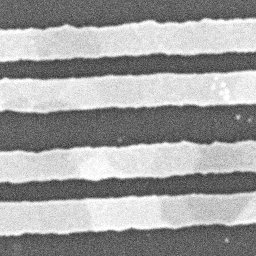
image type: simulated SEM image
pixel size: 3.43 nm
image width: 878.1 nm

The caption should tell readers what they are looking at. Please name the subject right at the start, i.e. lines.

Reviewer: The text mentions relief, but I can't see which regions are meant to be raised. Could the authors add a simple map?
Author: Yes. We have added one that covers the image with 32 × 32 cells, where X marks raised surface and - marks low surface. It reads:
--------------------------------
--------------------------------
-----------------------------X-X
------XXX-XX-XXXXXXXXXXXXXXXXXXX
XXXXXXXXXXXXXXXXXXXXXXXXXXXXXXXX
XXXXXXXXXXXXXXXXXXXXXXXXXXXXXXXX
XXXXXXXXXXXXXXXXXXXXXXXXXXXX----
XX------------------------------
--------------------------------
----------------XXXXXXXXXXXXXXXX
XXXXXXXXXXXXXXXXXXXXXXXXXXXXXXXX
XXXXXXXXXXXXXXXXXXXXXXXXXXXXXXXX
XXXXXXXXXXXXXXXXXXXXXXXXXXXXXXXX
XXXXXXXXXXXX--------------------
--------------------------------
--------------------------------
--------------------------------
--------------------------------
----------X--X-XXXXXXXXXXXXXXXXX
XXXXXXXXXXXXXXXXXXXXXXXXXXXXXXXX
XXXXXXXXXXXXXXXXXXXXXXXXXXXXXXXX
XXXXXXXXXXXXXXXXXXXXXXXXXXXXX---
XXXXXX--------------------------
--------------------------------
-----------------------XXXXXXXXX
XXXXXXXXXXXXXXXXXXXXXXXXXXXXXXXX
XXXXXXXXXXXXXXXXXXXXXXXXXXXXXXXX
XXXXXXXXXXXXXXXXXXXXXXXXXXXXXXXX
XXXXXXXXXXXXXXXX-XX-------------
--------------------------------
--------------------------------
--------------------------------